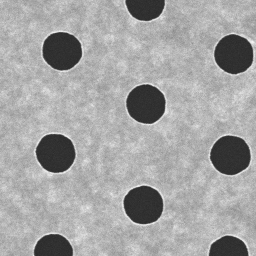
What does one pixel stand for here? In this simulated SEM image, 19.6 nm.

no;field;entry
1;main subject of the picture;holes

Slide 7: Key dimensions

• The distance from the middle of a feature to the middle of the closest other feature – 1.96 µm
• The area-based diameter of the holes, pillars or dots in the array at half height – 778 nm